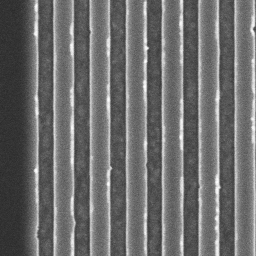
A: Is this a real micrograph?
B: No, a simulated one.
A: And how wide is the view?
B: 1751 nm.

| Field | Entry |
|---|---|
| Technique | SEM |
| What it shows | parallel lines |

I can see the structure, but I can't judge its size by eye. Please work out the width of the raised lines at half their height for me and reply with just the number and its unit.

133 nanometers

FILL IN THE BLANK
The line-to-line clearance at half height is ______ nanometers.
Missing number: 114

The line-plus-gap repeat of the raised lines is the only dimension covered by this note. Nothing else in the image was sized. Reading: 248 nm